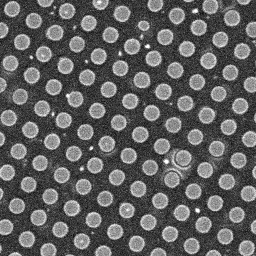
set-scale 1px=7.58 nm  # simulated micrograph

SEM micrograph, a regular array of raised bodies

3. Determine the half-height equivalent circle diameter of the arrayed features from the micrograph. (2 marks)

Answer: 114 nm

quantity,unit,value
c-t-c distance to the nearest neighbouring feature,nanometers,184